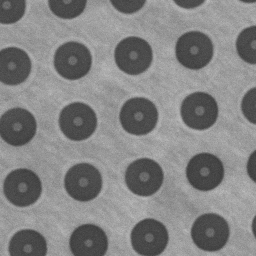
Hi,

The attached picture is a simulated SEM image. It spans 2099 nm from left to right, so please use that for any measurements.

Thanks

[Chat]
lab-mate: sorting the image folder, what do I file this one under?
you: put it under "an array of small figures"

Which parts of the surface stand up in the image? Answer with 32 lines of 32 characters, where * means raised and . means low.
....**.....***....****....****..
...***....*****...**************
...*****.***********************
******************************..
****************.******...****..
*******....****....***.....**...
...****.....**.....***..*..***..
....**......**.....***.....***..
.*..***....****....****..*******
....***....*****..**************
...*****************************
************************..*****.
****************...***.....***..
*..*****....***.....**.....***..
....***.....***..*..**.....***..
.....**.....***.....***....****.
.....**.....****...*************
....****...*********************
********************************
************************...****.
*********...****....***.....***.
*...****.....**.....***..*..***.
.....***..*..**......**.....****
..*..***.....***....****...*****
.....***....*****..*************
*...****************************
**************************.*****
******************..****.....**.
**********...***.....***.....**.
*....****....***..*..***.....***
*.....***.....**.....***....****
*.....***....****...************